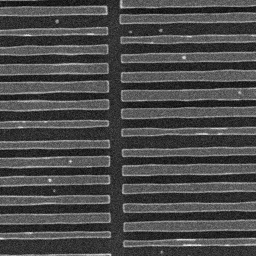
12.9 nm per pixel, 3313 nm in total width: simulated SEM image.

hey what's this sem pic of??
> groups of lines, slits or small figures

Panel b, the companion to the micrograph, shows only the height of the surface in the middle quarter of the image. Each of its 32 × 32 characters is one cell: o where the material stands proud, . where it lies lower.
ooooooooooo.....................
ooooooooooo.....................
..............oooooooooooooooooo
..............oooooooooooooooooo
....ooooooo....o..oo............
ooooooooooo.....................
ooooooooooo.....................
..............oooooooooooooooooo
..............oooooooooooooooooo
ooooooooooo.....................
ooooooooooo.....................
...............ooooooooooooooooo
..............oooooooooooooooooo
...............oooo.............
ooooooooooo.....................
oooooooooo......................
...............ooooooooooooooooo
..............oooooooooooooooooo
................................
ooooooooooo.....................
ooooooooooo.....................
...............ooooooooooooooooo
...............ooooooooooooooooo
ooooooooooo.....................
ooooooooooo.....................
ooooooooo......ooooooooooooooooo
...............ooooooooooooooooo
...............ooooooooooooooooo
ooooooooooo.....................
ooooooooooo.....................
...............ooooooooooooooooo
...............ooooooooooooooooo